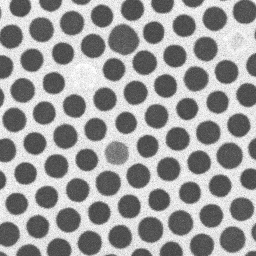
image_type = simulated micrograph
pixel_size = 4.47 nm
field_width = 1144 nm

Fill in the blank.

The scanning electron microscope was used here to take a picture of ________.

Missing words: a regular array of holes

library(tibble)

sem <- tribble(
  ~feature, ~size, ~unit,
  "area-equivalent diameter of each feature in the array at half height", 104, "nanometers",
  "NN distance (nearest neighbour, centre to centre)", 138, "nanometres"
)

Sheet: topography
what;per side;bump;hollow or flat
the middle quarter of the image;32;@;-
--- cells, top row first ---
@@@@@@@@@@-----@@------@@@---@@@
@@@@@@@@@@-----@@@-----@@@@@@@@-
@@@@@@@@@@-----@@@@--@@@@@@@@@--
@@@@@@@@@@@---@@@@@@@@@----@@@--
@@@@@@@@@@@@@@@@@--@@@@-----@@--
@@@@@@@@@@@@@@@-----@@@-----@@@-
@@@@@@@@@---@@@------@@-----@@@@
@@@@@@@@-----@@------@@-----@@@@
@----@@------@@------@@@@@@@@@-@
-----@@@-----@@@----@@@@@@@@@---
-----@@@-----@@@@@@@@@---@@@----
-----@@@@--@@@@@@@@@@-----@@----
-----@@@@@@@@@---@@@------@@----
@@@@@@@@@@@@@-----@@------@@@---
@@@@@@----@@@-----@@@-----@@@@@@
--@@@------@@-----@@@----@@@@@@@
---@@------@@@----@@@@@@@@----@@
---@@-----@@@@@@@@@@@@@@@@-----@
---@@@----@@@@@@@@@----@@------@
---@@@@@@@@@@-@@@@-----@@@-----@
--@@@@@@@@@@@--@@@------@@-----@
@@@@---@@@@----@@@-----@@@@@--@@
@@@-----@@------@@@----@@@@@@@@@
@@@-----@@@-----@@@@@@@@@--@@@@-
-@@-----@@@@--@@@@@@@@@@----@@@-
-@@-----@@@@@@@@@---@@@------@@-
-@@@@--@@@@@@@@@-----@@------@@-
@@@@@@@@@----@@@------@@-----@@@
@@@@@@@@------@@------@@----@@@@
@----@@@------@@-----@@@@@@@@@@@
@-----@@------@@@---@@@@@@@@@---
------@@------@@@@@@@@---@@@@---